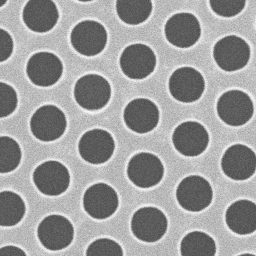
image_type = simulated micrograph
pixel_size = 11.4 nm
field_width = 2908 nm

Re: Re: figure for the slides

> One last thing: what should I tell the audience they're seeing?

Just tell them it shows a regular array of holes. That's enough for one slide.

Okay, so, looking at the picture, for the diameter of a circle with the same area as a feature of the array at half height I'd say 416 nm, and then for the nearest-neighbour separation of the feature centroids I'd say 613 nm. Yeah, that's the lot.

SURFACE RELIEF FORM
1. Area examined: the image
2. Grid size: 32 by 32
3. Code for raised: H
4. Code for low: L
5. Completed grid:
LHHLLLLHHHHHHHLLLLLHHHHHHHLLLLLH
HHHLLLLHHHHHHHHLLLLHHHHHHHHLLLHH
HHHLLLLHHHHHHHHLLLHHHLLLLHHHHHHH
HHHHLLLHHLLLLHHHHHHHHLLLLHHHHHHH
LHHHHHHHHLLLLHHHHHHHHLLLLHHHLLHH
LLHHHHHHHLLLLHHHHLHHHLLLHHHLLLLH
LLHHHLHHHHLLLHHLLLLHHHHHHHHLLLLH
LHHHLLLLHHHHHHHLLLLLHHHHHHHLLLLH
HHHLLLLLHHHHHHHLLLLHHHLLHHHHLLHH
HHHLLLLLHHLLLHHHLLHHHLLLLHHHHHHH
LHHHLLLHHLLLLLHHHHHHHLLLLLHHHHHH
LLHHHHHHHLLLLLHHHHHHHLLLLHHHLLLH
LLHHHHHHHLLLLLHHHLLHHHLLLHHLLLLH
LLHHHLLHHHLLLHHHLLLLHHHHHHHLLLLL
LHHHLLLLHHHHHHHLLLLLHHHHHHHLLLLL
HHHHLLLLHHHHHHHHLLLLHHHLLHHHLLLH
HHHHLLLLHHHLLHHHHLLHHHLLLLHHHHHH
LLHHHLLHHHLLLLHHHHHHHLLLLLHHHHHH
LLLHHHHHHHLLLLHHHHHHHHLLLLHHHLLH
LLLHHHHHHHLLLLHHHLLLHHHLLHHHLLLL
LLHHHLLLHHHHLHHHLLLLHHHHHHHHLLLL
LHHHLLLLLHHHHHHHLLLLHHHHHHHHLLLL
HHHHLLLLLHHHHHHHLLLLHHHLLLHHHLHH
HHHHHLLLHHHLLLHHHHHHHHLLLLHHHHHH
LLHHHHLHHHLLLLLHHHHHHHLLLLLHHHHH
LLLHHHHHHHLLLLLHHHHHHHLLLLHHHLLL
LLLHHHHHHHHLLLHHHLLLHHHHLHHHLLLL
LLLHHLLLLHHHHHHHLLLLLHHHHHHHLLLL
HHHHHLLLLHHHHHHHLLLLLHHHHHHHHLLL
HHHHHLLLLHHHHHHHHLLLHHHLLLHHHHHH
HHHHHLLLLHHLLLLHHHHHHHHLLLLHHHHH
LLLHHHHHHHHLLLLHHHHHHHHLLLLHHHHH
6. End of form